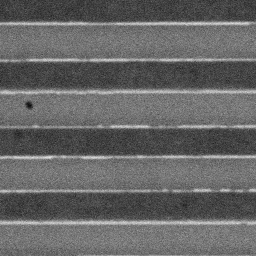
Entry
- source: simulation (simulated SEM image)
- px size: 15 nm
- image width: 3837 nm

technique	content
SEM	lines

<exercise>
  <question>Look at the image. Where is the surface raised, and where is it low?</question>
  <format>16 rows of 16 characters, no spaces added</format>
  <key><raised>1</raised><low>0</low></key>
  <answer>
1111111111111111
0000000000000000
0000000000000000
0000000000000000
1111111111111111
1111111111111111
0000000000000000
0000000000000000
1111111111111111
1111111111111111
0000000000000000
0000000000000000
1111111111111111
1111111111111111
0000000000000000
0000000000000000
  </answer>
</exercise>